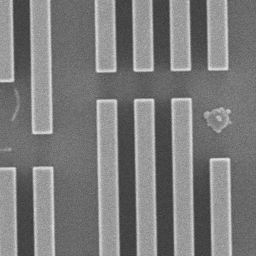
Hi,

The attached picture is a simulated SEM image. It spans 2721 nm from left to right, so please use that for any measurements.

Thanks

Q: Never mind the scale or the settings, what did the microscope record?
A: groups of lines, slits or small figures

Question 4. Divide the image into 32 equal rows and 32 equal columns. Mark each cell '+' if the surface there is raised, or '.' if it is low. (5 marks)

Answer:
++..++......++...++..+++..++....
++..++......++...++..+++..++....
++..++......++...++..+++..++....
++..++......++...++..+++..++....
++..++......++...++..+++..++....
++..++......++...++..+++..++....
++..++......++...++..+++..++....
++..++......++...++..+++..++....
++..++......++...++..+++..++....
++..++..........................
....++..........................
....++..........................
....++...........++...++........
....++......+++..++...++........
....++......+++..++...++........
....++......+++..++...++........
....++......+++..++...++........
............+++..++...++........
............+++..++...++........
............+++..++...++........
............+++..++...++..+++...
++..+++.....+++..++...++..+++...
++..+++.....+++..++...++..+++...
++..+++.....+++..++...++..+++...
++..+++.....+++..++...++..+++...
++..+++.....+++..++...++..+++...
++..+++.....+++..++...++..+++...
++..+++.....+++..++...++..+++...
++..+++.....+++..++...++..+++...
++..+++......++..++...++..+++...
++..+++......++..++...++..+++...
++..+++......++..+++..++..+++...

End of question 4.